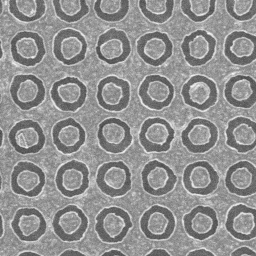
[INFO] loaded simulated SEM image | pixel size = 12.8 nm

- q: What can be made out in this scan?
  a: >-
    a regular array of ring-shaped grooves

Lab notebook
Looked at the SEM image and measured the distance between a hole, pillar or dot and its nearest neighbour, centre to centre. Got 528 nanometers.